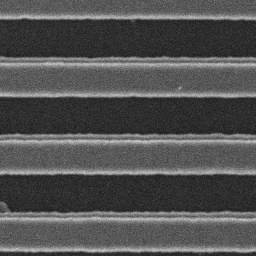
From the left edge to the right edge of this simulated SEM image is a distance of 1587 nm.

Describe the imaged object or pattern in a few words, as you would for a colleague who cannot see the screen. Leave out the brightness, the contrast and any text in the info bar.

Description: lines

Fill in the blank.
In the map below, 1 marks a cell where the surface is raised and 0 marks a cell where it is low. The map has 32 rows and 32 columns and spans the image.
11111111111111111111111111111111
11111111111111111111111111111111
00000000000000000000000000000000
00000000000000000000000000000000
00000000000000000000000000000000
00000000000000000000000000000000
00000000000000000000000000000000
11111111111111111111111111111111
11111111111111111111111111111111
11111111111111111111111111111111
11111111111111111111111111111111
11111111111111111111111111111111
00000000000000000000000000000000
00000000000000000000000000000000
00000000000000000000000000000000
00000000000000000000000000000000
00000000000000000000000000000000
11111111111111111111111111111111
11111111111111111111111111111111
11111111111111111111111111111111
11111111111111111111111111111111
11111111111111111111111111111111
00000000000000000000000000000000
00000000000000000000000000000000
00000000000000000000000000000000
00000000000000000000000000000000
00000000000000000000000000000000
11111111111111111111111111111111
11111111111111111111111111111111
11111111111111111111111111111111
11111111111111111111111111111111
00000000000000000000000000000000